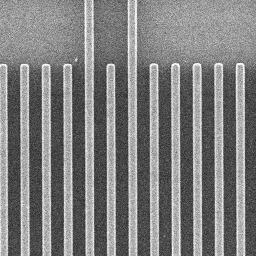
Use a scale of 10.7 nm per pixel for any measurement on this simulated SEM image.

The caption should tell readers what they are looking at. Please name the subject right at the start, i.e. groups of lines, slits or small figures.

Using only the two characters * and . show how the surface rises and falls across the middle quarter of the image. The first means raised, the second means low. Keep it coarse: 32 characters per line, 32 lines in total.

**...**....**...**....**...**...
**...**....**...**....**...**...
**...**....**...**....**...**...
**...**....**...**....**...**...
**...**....**...**....**...**...
**...**....**...**....**...**...
**...**....**...**....**...**...
**...**....**...**....**...**...
**...**....**...**....**...**...
**...**....**...**....**...**...
**...**....**...**....**...**...
**...**....**...**....**...**...
**...**....**...**....**...**...
**...**....**...**....**...**...
**...**....**...**....**...**...
**...**....**...**....**...**...
**...**....**...**....**...**...
**...**....**...**....**...**...
**...**....**...**....**...**...
**...**....**...**....**...**...
**...**....**...**....**...**...
**...**....**...**....**...**...
**...**....**...**....**...**...
**...**....**...**....**...**...
**...**....**...**....**...**...
**...**....**...**....**...**...
**...**....**...**....**...**...
**...**....**...**....**...**...
**...**....**...**....**...**...
**...**....**...**....**...**...
**...**....**...**....**...**...
**...**....**...**....**...**...